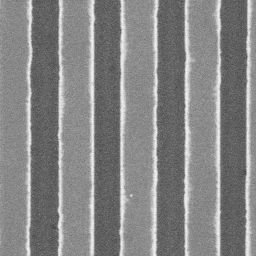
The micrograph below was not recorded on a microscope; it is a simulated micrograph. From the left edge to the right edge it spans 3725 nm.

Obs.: lines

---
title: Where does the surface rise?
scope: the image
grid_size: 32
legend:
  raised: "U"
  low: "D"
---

UUUUDDDUUUUUDDDUUUUUDDDUUUUUDDDU
UUUUDDDUUUUUDDDUUUUUDDDUUUUDDDDU
UUUUDDDUUUUUDDDUUUUUDDDUUUUDDDDU
UUUUDDDUUUUUDDDUUUUUDDDUUUUDDDDU
UUUUDDDUUUUUDDDUUUUUDDDUUUUDDDDU
UUUUDDDUUUUUDDDUUUUUDDDUUUUDDDDU
UUUUDDDUUUUUDDDUUUUUDDDUUUUDDDDU
UUUUDDDUUUUUDDDUUUUUDDDUUUUDDDDU
UUUUDDDUUUUUDDDUUUUUDDDUUUUDDDDU
UUUUDDDDUUUUDDDUUUUUDDDUUUUUDDDU
UUUUDDDUUUUUDDDUUUUUDDDUUUUDDDDU
UUUUDDDUUUUUDDDUUUUUDDDUUUUDDDDU
UUUUDDDUUUUUDDDUUUUUDDDUUUUDDDDU
UUUUDDDUUUUUDDDUUUUUDDDUUUUDDDDU
UUUUDDDUUUUUDDDUUUUDDDDUUUUDDDDU
UUUUDDDUUUUUDDDUUUUDDDDUUUUDDDDU
UUUUDDDUUUUUDDDUUUUUDDDUUUUDDDDU
UUUUDDDUUUUUDDDUUUUDDDDUUUUDDDDU
UUUUDDDUUUUUDDDUUUUDDDDUUUUDDDDU
UUUUDDDUUUUUDDDUUUUUDDDUUUUDDDDU
UUUUDDDUUUUUDDDUUUUDDDDUUUUDDDDU
UUUUDDDUUUUUDDDUUUUUDDDUUUUDDDDU
UUUUDDDUUUUUDDDUUUUUDDDUUUUDDDDU
UUUUDDDUUUUUDDDUUUUDDDDUUUUDDDDU
UUUUDDDUUUUUDDDUUUUDDDDUUUUDDDDU
UUUUDDDUUUUUDDDUUUUDDDDUUUUDDDDU
UUUUDDDUUUUUDDDUUUUDDDDUUUUDDDDU
UUUUDDDUUUUUDDDUUUUDDDDUUUUDDDDU
UUUUDDDUUUUUDDDUUUUDDDDUUUUDDDDU
UUUUDDDUUUUUDDDUUUUDDDDUUUUDDDDU
UUUUDDDUUUUUDDDUUUUDDDDUUUUDDDDU
UUUUDDDUUUUUDDDUUUUDDDDUUUUDDDDU